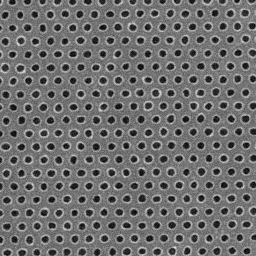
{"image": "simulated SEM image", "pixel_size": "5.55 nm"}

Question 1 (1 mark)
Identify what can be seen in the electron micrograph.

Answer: a regular array of holes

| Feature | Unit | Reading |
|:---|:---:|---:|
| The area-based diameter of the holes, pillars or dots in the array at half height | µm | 0.043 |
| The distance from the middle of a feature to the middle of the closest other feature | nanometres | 80.9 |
